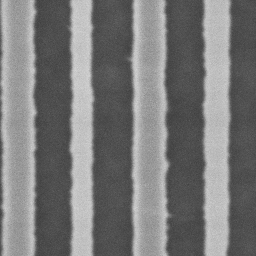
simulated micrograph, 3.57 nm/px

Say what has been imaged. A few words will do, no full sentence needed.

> lines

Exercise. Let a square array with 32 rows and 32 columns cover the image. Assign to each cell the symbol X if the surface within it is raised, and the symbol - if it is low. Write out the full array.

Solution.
XXXX-----XX------XXXX-----XXX---
XXXX-----XX------XXX------XXX---
XXXX-----XX------XXXX----XXXX---
XXXX-----XXX-----XXXX----XXXX---
XXXX-----XX------XXXX----XXXX---
XXXX-----XX------XXXX-----XXX---
XXXX-----XX------XXXX-----XXX---
XXXX-----XX------XXXX-----XXX---
XXXX-----XX------XXXX-----XXX---
XXXX-----XX------XXXX-----XXX---
XXXX-----XX------XXX------XXX---
XXXX-----XXX-----XXXX-----XXX---
XXXX-----XXX-----XXXX-----XXX---
XXXX-----XXX-----XXXX----XXXX---
XXXX-----XXX-----XXXX-----XXX---
XXXX-----XXX-----XXXX-----XXX---
XXXX-----XXX-----XXXX-----XXX---
XXXX-----XXX-----XXXX----XXXX---
XXXX-----XXX-----XXXX-----XXX---
XXXX-----XXX-----XXXX-----XXX---
XXXX-----XXX-----XXXX-----XXX---
XXXX-----XX------XXXX-----XXX---
XXXX-----XXX-----XXXX-----XXX---
XXXX-----XXX-----XXXX-----XXX---
XXXX-----XXX-----XXXX-----XXX---
XXXX-----XXX-----XXXX-----XXX---
XXXX-----XXX-----XXXX-----XXX---
XXXX-----XXX-----XXXX-----XXX---
XXXX-----XXX-----XXXX-----XXX---
XXXX-----XX------XXXX-----XXX---
XXXX-----XXX-----XXXX-----XXX---
XXXX-----XXX-----XXXX-----XX----